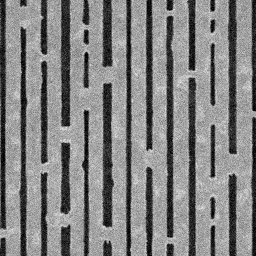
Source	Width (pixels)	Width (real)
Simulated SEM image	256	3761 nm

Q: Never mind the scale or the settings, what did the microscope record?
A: parallel lines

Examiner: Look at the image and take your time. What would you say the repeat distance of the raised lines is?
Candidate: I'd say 309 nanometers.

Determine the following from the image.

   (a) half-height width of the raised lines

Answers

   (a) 0.207 microns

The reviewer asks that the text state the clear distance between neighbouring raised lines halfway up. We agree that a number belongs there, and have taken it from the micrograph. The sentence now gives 0.0973 micrometres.